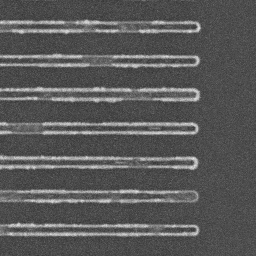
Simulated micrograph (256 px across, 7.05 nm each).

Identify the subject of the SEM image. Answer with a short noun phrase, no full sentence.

parallel lines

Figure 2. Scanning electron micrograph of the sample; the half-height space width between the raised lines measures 159 nanometres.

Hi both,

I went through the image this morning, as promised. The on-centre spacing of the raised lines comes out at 33.9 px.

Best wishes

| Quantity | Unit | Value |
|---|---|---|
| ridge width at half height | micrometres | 0.0758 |